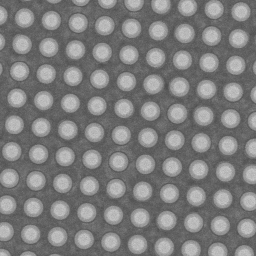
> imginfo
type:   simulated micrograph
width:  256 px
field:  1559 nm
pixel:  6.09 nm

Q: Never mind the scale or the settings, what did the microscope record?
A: an array of small figures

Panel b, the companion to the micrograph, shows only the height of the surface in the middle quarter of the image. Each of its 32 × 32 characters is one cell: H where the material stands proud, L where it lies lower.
LLLLLLLLLLLLLLLLLLLLLLHHLLLLHHHL
LHHHLLLLHLLLLLLLLLLLLLLLLLLLLLLL
HHHHLLLHHHHLLLHHHLLLLLLLLLLLLLLL
HHHHHLLHHHHLLHHHHHLLHHHHLLLLHHLL
HHHHLLLHHHHLLHHHHHLLHHHHHLLHHHHL
LLLLLLLHHHLLLHHHHHLLHHHHHLLHHHHL
LLLLLLLLLLLLLLHHHLLLHHHHLLLHHHHL
LLLLLLLLLLLLLLLLLLLLLLLLLLLHHHHL
HHHHLLLHHHLLLLLLLLLLLLLLLLLLLLLL
HHHHLLHHHHLLLHHHHLLLLHLLLLLLLLLL
HHHHLLHHHHHLLHHHHLLLHHHHLLLHHHLL
HHHLLLHHHHLLLHHHHLLHHHHHLLHHHHHL
LLLLLLLHHLLLLHHHHLLHHHHHLLHHHHHL
LLLLLLLLLLLLLLLLLLLLHHHLLLHHHHHL
HHLLLLLLLLLLLLLLLLLLLLLLLLLHHHLL
HHHLLLHHHLLLLLLLLLLLLLLLLLLLLLLL
HHHLLHHHHHLLHHHHLLLLHHHLLLLLLLLL
HHHLLHHHHHLLHHHHHLLHHHHLLLHHHHLL
HHLLLLHHHHLLHHHHHLLHHHHLLHHHHHLL
LLLLLLLLLLLLLHHHLLLHHHHLLHHHHHLL
LLLLLLLLLLLLLLLLLLLLHHLLLLHHHHLL
HHLLLLHLLLLLLLLLLLLLLLLLLLLLLLLL
HHHLLHHHHLLLHHHLLLLLLLLLLLLLLLLL
HHHLLHHHHLLLHHHHLLLHHHLLLLHHLLLL
HHLLLHHHHLLHHHHHLLHHHHHLLHHHHLLL
HLLLLHHHHLLLHHHHLLHHHHHLLHHHHLLH
LLLLLLLLLLLLLHHLLLHHHHLLLHHHHLLH
LLLLLLLLLLLLLLLLLLLLLLLLLHHHHLLL
HHLLLHHHLLLLLLLLLLLLLLLLLLLLLLLL
HHLLHHHHLLLHHHHLLLLHLLLLLLLLLLLL
HHLLHHHHHLLHHHHLLLHHHHLLLHHHLLLL
HLLLHHHHLLLHHHHLLHHHHHLLHHHHHLLH